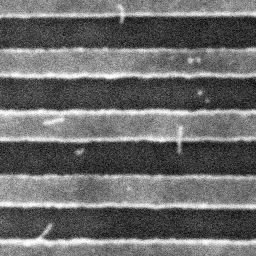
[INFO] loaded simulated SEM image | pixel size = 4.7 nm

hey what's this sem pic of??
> lines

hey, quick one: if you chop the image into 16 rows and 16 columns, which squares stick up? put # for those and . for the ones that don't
################
................
................
################
################
................
................
################
################
................
................
################
################
................
................
################